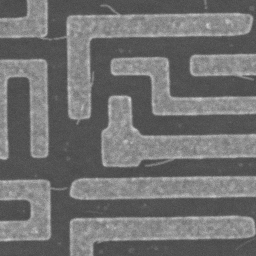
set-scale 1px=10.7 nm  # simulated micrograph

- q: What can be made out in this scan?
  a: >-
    wiring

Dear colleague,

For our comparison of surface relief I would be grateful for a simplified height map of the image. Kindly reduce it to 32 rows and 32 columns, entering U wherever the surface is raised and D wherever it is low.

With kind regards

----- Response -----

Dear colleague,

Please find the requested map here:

DDDDUUDDDDDDDDDDDDDDDDDDDDDDDDDD
DDDDUUDDDDDDDDDDDDDDDDDDDDDDDDDD
UUUUUUDDDUUUUUUUUUUUUUUUUUUUUUUD
UUUUUUDDDUUUUUUUUUUUUUUUUUUUUUUD
UUUUUDDDUUUUUUUUUUUDDDDDDDDDDDDD
DDDDDDDDDUUDDDDDDDDDDDDDDDDDDDDD
DDDDDDDDDUUDDDDDDDDDDDDDDDDDDDDD
DDDDDDDDDUUDDDUUUUUUUDDDUUUUUUUU
UUUUUUDDDUUDDDUUUUUUUDDDUUUUUUUU
UUUUUUDDDUUDDDDDDDDUUDDDDDDDDDDD
UDDDUUDDDUUDDDDDDDDUUDDDDDDDDDDD
UDDDUUDDDUUDDDDDDDDUUDDDDDDDDDDD
UDDDUUDDDUUDDDUUDDDUUUUUUUUUUUUU
UDDDUUDDDUUDDDUUDDDUUUUUUUUUUUUU
UDDDUUDDDUUDDDUUDDDDDDDDDDDDDDDD
UDDDUUDDDDDDDDUUDDDDDDDDDDDDDDDD
UDDDUUDDDDDDDUUUUDDDDDDDDDDDDDDD
UDDDUUDDDDDDDUUUUUUUUUUUUUUUUUUU
UDDDUUDDDDDDDUUUUUUUUUUUUUUUUUUU
UDDDUUDDDDDDDUUUUUUUUUUUUUUUUUUU
DDDDDDDDDDDDDUUUUDDDDDDDDDDDDDDD
DDDDDDDDDDDDDDDDDDDDDDDDDDDDDDDD
DDDDDDDDDDUUUUUUUUUUUUUUUUUUUUUU
UUUUUUDDDUUUUUUUUUUUUUUUUUUUUUUU
UUUUUUDDDUUUUUUUUUUUUUUUUUUUUUDD
DDDDUUDDDDDDDDDDDDDDDDDDDDDDDDDD
DDDDUUDDDDDDDDDDDDDDDDDDDDDDDDDD
DDDDUUDDDUUUUUUUUUUUUUUUUUUUUUUU
UUUUUUDDDUUUUUUUUUUUUUUUUUUUUUUU
UUUUUUDDDUUUUUUUUUUUUUUUUUUUUUUD
DDDDDDDDDUUUDDDDDDDDDDDDDDDDDDDD
DDDDDDDDDUUUDDDDDDDDDDDDDDDDDDDD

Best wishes